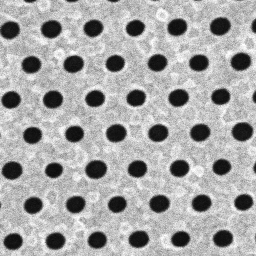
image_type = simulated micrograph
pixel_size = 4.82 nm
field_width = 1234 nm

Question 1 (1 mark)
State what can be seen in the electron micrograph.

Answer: a regular array of holes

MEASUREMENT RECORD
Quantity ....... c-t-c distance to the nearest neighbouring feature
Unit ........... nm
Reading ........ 196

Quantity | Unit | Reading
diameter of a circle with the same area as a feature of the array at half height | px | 17.8